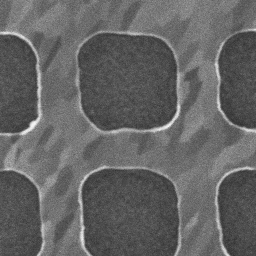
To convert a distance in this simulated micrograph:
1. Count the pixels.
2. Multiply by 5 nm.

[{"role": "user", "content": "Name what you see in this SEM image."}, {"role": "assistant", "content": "holes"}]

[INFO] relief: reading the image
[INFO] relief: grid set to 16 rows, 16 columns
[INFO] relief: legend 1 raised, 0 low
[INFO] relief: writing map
1111111111111111
1111111111111111
0111100000111100
0011100000011100
0011100000011100
0011100000011100
0011100000011100
0011110000011100
1111111111111111
1111111111111111
1111111111111111
0011100000011100
0011100000011100
0001100000011100
0001100000011100
0001100000011100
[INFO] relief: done